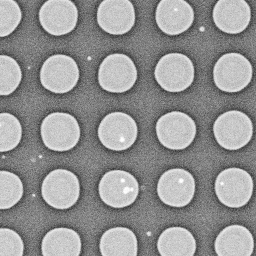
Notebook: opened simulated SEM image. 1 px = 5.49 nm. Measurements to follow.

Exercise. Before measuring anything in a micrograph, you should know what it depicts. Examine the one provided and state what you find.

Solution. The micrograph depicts an array of small figures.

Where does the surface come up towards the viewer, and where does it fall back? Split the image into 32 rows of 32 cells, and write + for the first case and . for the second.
++....+++....+++....+++....++++.
+++..+++++..+++++...++++...++++.
++...+++++..+++++...++++...++++.
++....+++....+++....+++....++++.
................................
................................
................................
++....+++....+++....++++...++++.
++...+++++..+++++...++++...++++.
+++..+++++..+++++..+++++...++++.
++...++++....++++...++++...++++.
+......+........................
................................
................................
++....+++....+++....+++.....+++.
++...+++++...++++...++++...++++.
+++..+++++..+++++...++++...++++.
++...+++++...++++...++++...++++.
++....+++.....++.....++.....++..
................................
................................
+......++.....++.....++.....+++.
++....++++...++++...++++...++++.
+++..+++++..+++++...++++...+++++
+++..+++++...++++...++++...++++.
++....+++....+++.....++.....+++.
................................
................................
...............+.....++.....+++.
++....++++...++++...++++...++++.
+++..+++++...++++...++++...+++++
+++..+++++...++++...++++...++++.